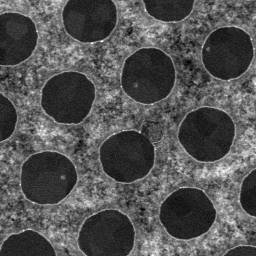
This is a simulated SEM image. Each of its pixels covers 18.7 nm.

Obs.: raised bodies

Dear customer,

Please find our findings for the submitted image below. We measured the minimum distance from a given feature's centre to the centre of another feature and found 82 px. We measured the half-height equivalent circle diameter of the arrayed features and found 1050 nm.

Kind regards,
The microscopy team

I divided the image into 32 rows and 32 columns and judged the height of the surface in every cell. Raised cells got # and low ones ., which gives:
........######....######........
........#######...######........
####....#######.....###.........
####....######.............###..
#####....#####............#####.
#####....................#######
####.............###.....#######
###.............#####....#######
...............#######....#####.
.......####....#######.....###..
......######...#######..........
.....#######....#####...........
#....#######.....###............
##...######..............##.....
##....#####............######...
##......##........##...######...
##.............#####..#######...
#............#######..#######...
............#######....######...
....####....#######.....####....
...######....######.............
...#######...######............#
...#######....###.............##
...######..............#......##
...#####.............#####....##
.....##.............#######...##
............###.....#######....#
...........#####....#######.....
..........#######....#####......
.####.....#######....####.......
######....#######...............
#######...######............####